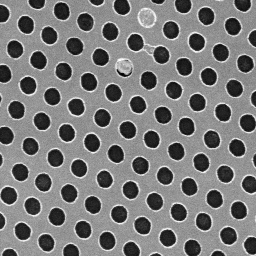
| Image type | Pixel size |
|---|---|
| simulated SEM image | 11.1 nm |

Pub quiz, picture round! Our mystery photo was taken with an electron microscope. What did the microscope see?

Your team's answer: a regular array of holes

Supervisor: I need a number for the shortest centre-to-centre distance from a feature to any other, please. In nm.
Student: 292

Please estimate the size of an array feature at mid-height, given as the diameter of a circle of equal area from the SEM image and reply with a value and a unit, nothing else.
195 nm